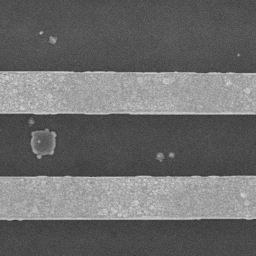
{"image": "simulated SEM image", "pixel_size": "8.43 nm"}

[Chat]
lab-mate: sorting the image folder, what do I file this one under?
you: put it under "lines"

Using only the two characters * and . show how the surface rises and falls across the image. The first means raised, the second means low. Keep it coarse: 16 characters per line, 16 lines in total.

................
................
................
................
................
****************
****************
................
................
................
................
****************
****************
****************
................
................